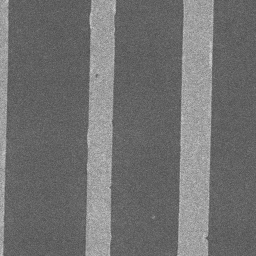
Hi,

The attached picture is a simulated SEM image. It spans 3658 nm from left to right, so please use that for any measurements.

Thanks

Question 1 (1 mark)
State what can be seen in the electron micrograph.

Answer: one or a few lines or trenches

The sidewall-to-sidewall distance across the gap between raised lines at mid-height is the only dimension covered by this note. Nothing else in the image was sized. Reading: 1090 nm